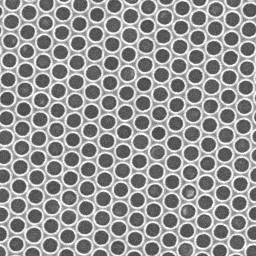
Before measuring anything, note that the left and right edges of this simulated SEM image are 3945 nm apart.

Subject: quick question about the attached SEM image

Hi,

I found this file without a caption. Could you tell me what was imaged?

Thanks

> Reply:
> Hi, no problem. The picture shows a regular array of holes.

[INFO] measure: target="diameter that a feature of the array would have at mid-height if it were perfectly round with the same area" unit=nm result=235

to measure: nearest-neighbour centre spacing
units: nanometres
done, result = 295